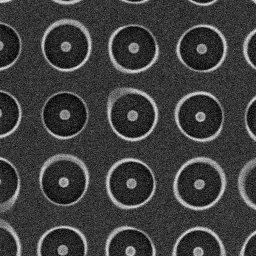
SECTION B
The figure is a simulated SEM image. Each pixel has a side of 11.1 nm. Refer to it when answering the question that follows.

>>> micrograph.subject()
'an array of small figures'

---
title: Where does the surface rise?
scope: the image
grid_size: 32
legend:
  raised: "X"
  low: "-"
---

XXXXXXXXXXXXXXXXXXXXXXXXX-XXXXXX
XXXXXXXXXXXXXXXXXXXXXXXXXXXXXXXX
XXXXXXXXXXXXXXXXXXXXXXXXXXXXXXXX
-XXXXX----XXXXX---XXXXXX--XXXXXX
--XXXX-----XXX-----XXXX-----XXX-
--XXX------XXX-----XXX------XXX-
--XXXX-----XXX------XX------XXX-
--XXXX-----XXX-----XXXX-----XXX-
XXXXXXX--XXXXXX---XXXXXX---XXXXX
XXXXXXXXXXXXXXXXXXXXXXXXXXXXXXXX
XXXXXXXXXXXXXXXXXXXXXXXXXXXXXXXX
XXXXXXXXXXXXXXX--XXXXXXXXXXXXXXX
--XXXX----XXXX-----XXXX----XXXXX
--XXXX-----XXX-----XXX------XXX-
--XXX------XXX-----XXX------XXX-
--XXXX-----XXX-----XXX------XXX-
-XXXXX----XXXXX----XXXX----XXXX-
XXXXXXXXXXXXXXXXXXXXXXXXXXXXXXXX
XXXXXXXXXXXXXXXXXXXXXXXXXXXXXXXX
XXXXXXXXXXXXXXXXXXXXXXXXXXXXXXXX
-XXXXX----XXXXX---XXXXX----XXXXX
--XXX------XXX-----XXX------XXX-
--XXX------XXX-----XXX------XX--
--XXX------XXX-----XXX------XX--
--XXXX----XXXX-----XXX-----XXXX-
-XXXXXX--XXXXXX---XXXXX---XXXXX-
XXXXXXXXXXXXXXXXXXXXXXXXXXXXXXXX
XXXXXXXXXXXXXXXXXXXXXXXXXXXXXXXX
-XXXXXXXXXXXXXXXXXXXXXXXXXXXXXXX
--XXXX----XXXX----XXXXX----XXXX-
--XXX------XXX-----XXX------XXX-
--XXX------XX------XXX------XX--